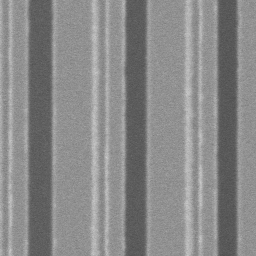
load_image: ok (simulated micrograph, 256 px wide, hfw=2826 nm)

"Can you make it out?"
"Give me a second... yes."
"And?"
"lines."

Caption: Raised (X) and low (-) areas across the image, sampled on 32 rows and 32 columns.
XXX----XXXXXXXX----XXXXXXXX---XX
XXX----XXXXXXXX----XXXXXXXX---XX
XXX----XXXXXXXX----XXXXXXXX---XX
XXX----XXXXXXXX----XXXXXXXX---XX
XXX----XXXXXXXX----XXXXXXXX---XX
XXX----XXXXXXXX----XXXXXXXX---XX
XXX----XXXXXXXX----XXXXXXXX---XX
XXX----XXXXXXXX----XXXXXXXX---XX
XXX----XXXXXXXX----XXXXXXXX---XX
XXX----XXXXXXXX----XXXXXXXX---XX
XXX----XXXXXXXX----XXXXXXXX---XX
XXX----XXXXXXXX----XXXXXXXX---XX
XXX----XXXXXXXX----XXXXXXXX---XX
XXX----XXXXXXXX----XXXXXXXX---XX
XXX----XXXXXXXX----XXXXXXXX---XX
XXX----XXXXXXXX----XXXXXXXX---XX
XXX----XXXXXXXX----XXXXXXXX---XX
XXX----XXXXXXXX----XXXXXXXX---XX
XXX----XXXXXXXX----XXXXXXXX---XX
XXX----XXXXXXXX---XXXXXXXXX---XX
XXX----XXXXXXXX---XXXXXXXXX---XX
XXX----XXXXXXXX---XXXXXXXXX---XX
XXX----XXXXXXXX----XXXXXXXX---XX
XXX----XXXXXXXX----XXXXXXXX---XX
XXX----XXXXXXXX---XXXXXXXXX---XX
XXX----XXXXXXXX---XXXXXXXXX---XX
XXX----XXXXXXXX----XXXXXXXX---XX
XXX----XXXXXXXX----XXXXXXXX---XX
XXX----XXXXXXXX----XXXXXXXX---XX
XXX----XXXXXXXX----XXXXXXXX---XX
XXX----XXXXXXXX----XXXXXXXX---XX
XXX----XXXXXXXX---XXXXXXXXX---XX